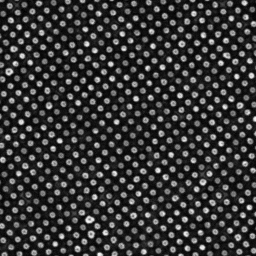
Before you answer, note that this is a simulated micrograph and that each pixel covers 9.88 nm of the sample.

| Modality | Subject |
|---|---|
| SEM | a regular array of raised bodies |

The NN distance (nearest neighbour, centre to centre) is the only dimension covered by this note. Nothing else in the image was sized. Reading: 99.4 nanometers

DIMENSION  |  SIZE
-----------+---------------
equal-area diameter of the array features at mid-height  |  52.3 nm